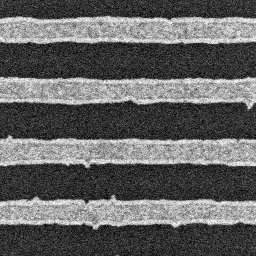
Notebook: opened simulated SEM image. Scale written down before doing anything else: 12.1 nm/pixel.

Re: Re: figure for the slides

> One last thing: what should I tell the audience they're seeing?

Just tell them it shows parallel lines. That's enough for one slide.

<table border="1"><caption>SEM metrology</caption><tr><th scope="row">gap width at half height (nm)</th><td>493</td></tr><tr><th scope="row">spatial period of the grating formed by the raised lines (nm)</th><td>732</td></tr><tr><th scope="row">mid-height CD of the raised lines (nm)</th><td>240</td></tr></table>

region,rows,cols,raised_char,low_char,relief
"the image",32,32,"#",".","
................................
................................
..##.......###..........#.......
################################
################################
................................
................................
................................
................................
................................
################################
################################
.##.###########..###.####.######
................................
................................
................................
................................
................................
################################
################################
................................
................................
................................
................................
................................
###########################.##..
################################
########################.#######
................................
................................
................................
................................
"